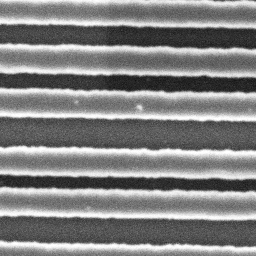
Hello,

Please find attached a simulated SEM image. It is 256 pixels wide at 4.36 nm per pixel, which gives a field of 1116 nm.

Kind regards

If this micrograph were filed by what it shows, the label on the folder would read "lines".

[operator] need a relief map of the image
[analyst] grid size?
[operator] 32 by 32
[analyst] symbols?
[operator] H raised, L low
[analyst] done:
HHHHHHHHHHHHHHHHHHHHHHHHHHHHHHHH
HHHHHHHHHHHHHHHHHHHHHHHHHHHHHHHH
HHHHHHHHHHHHHHHHHHHHHHHHHHHHHHHH
LLLLLLLLLLLLLLLLLLLLLLLLLLLLLLLL
LLLLLLLLLLLLLLLLLLLLLLLLLLLLLLLL
LLLLLLLLLLLLLLLLLLLLLLLLLLLLLLLL
HHHHHHHHHHHHHHHHHHHHHHHHHHHHHHHH
HHHHHHHHHHHHHHHHHHHHHHHHHHHHHHHH
HHHHHHHHHHHHHHHHHHHHHHHHHHHHHHHH
LLLLLLLLLLLLLLLLLLLLLLLLLLLLHHLH
LLLLLLLLLLLLLLLLLLLLLLLLLLLLLLLL
HHHHHHHHHHHHHHHHLHHLLLLLLLLLLLLL
HHHHHHHHHHHHHHHHHHHHHHHHHHHHHHHH
HHHHHHHHHHHHHHHHHHHHHHHHHHHHHHHH
LLLLHHHHHHHHHHHHHHHHHHHHHHHHHHHH
LLLLLLLLLLLLLLLLLLLLLLLLLLLLLLLL
LLLLLLLLLLLLLLLLLLLLLLLLLLLLLLLL
LLLLLLLLLLLLLLLLLLLLLLLLLLLLLLLL
LLHLLLLLLLLLLLLLLLLLLLLLLLLLLLLL
HHHHHHHHHHHHHHHHHHHHHHHHHHHHHHHH
HHHHHHHHHHHHHHHHHHHHHHHHHHHHHHHH
HHHHHHHHHHHHHHHHHHHHHHHHHHHHHHHH
LLLLLLLLLLLLLLLLLLLLLLLLLLLLLLLL
LLLLLLLLLLLLLLLLLLLLLLLLLLLLLLLL
HHHHHHHHHHHHHHHHHHHHHHHHHHHHHHHH
HHHHHHHHHHHHHHHHHHHHHHHHHHHHHHHH
HHHHHHHHHHHHHHHHHHHHHHHHHHHHHHHH
LLLLLLLLLLLLLLLLLLLLLLLLLLLLLLLL
LLLLLLLLLLLLLLLLLLLLLLLLLLLLLLLL
LLLLLLLLLLLLLLLLLLLLLLLLLLLLLLLL
HHHHHLLLLLLLLLLLLLLLLLLLLLLLLLLL
HHHHHHHHHHHHHHHHHHHHHHHHHHHHHHHH